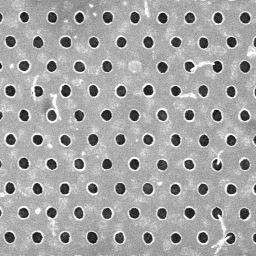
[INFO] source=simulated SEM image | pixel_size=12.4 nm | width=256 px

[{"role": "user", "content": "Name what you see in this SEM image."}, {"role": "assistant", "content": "a regular array of holes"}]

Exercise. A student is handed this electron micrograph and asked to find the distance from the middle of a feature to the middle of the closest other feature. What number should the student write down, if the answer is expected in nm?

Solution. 338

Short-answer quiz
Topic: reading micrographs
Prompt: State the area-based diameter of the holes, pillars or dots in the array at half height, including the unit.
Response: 139 nanometers